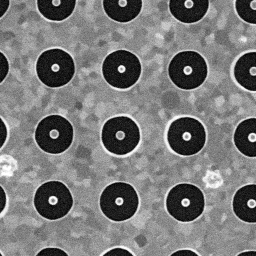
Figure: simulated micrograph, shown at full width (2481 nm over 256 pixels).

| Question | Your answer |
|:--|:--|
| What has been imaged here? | an array of small figures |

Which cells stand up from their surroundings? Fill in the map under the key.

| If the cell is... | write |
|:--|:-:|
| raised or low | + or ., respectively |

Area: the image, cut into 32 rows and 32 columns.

.++++....++++..+..+++..+..+++..+
.++++....++++.....+++.....++++..
++++++..++++++..++++++...+++++..
++++++++++++++++++++++++++++++++
++++++++++++++++++++++++++++++++
++++++++++++++++++++++++++++++++
+++++...++++++..+++++++..++++++.
.++++....++++....++++.....++++..
.+++.....++++.....+++.....+++...
.++++....++++.....+++.....+++...
+++++...++++++...+++++...+++++..
++++++++++++++++++++++++++++++++
++++++++++++++++++++++++++++++++
++++++++++++++++++++++++++++++++
++++++..+++++++.++++++++++++++++
.++++....++++....++++....+++++..
.+++.....++++.....+++.....+++...
.+++.....++++.....+++.....+++...
+++++....++++....++++....+++++..
++++++++++++++..+++++++++++++++.
++++++++++++++++++++++++++++++++
++++++++++++++++++++++++++++++++
++++++++++++++++++++++++++++++++
+++++...+++++....++++....+++++..
.+++.....++++....++++....++++...
.+++.....+++.....++++.....+++..+
+++++....++++....++++....++++...
++++++++++++++..++++++..++++++..
++++++++++++++++++++++++++++++++
++++++++++++++++++++++++++++++++
++++++++++++++++++++++++++++++++
+++++...+++++...++++++..++++++..